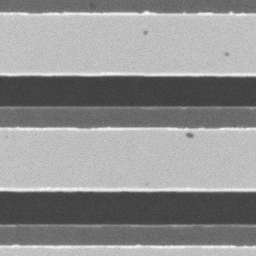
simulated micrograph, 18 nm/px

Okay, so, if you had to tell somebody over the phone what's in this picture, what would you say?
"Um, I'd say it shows lines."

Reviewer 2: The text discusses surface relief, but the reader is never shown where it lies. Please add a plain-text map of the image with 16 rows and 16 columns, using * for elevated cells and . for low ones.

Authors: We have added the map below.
****************
****************
****************
****************
****************
................
................
****************
****************
****************
****************
****************
................
................
****************
****************